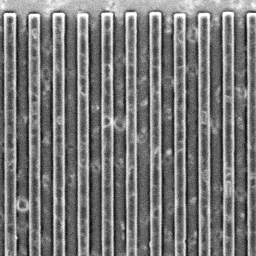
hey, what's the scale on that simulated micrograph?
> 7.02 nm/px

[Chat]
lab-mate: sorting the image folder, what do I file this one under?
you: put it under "parallel lines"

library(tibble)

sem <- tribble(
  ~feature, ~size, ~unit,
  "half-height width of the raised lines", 0.0729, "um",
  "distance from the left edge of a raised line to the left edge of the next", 170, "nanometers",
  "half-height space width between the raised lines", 97.4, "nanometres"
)